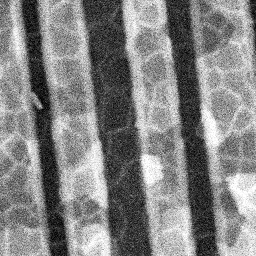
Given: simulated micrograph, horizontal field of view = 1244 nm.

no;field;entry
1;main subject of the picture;one or a few lines or trenches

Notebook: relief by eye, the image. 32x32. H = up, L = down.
HHLLLHHHHHLLLLLLHHHHLLLLHHHHHHLL
HHLLLLHHHHLLLLLLHHHHLLLLHHHHHHHL
HHLLLLHHHHLLLLLLHHHHLLLLHHHHHHHL
HHLLLLHHHHLLLLLLHHHHHLLLLHHHHHHL
HHHLLLHHHHLLLLLLHHHHHLLLLHHHHHHL
HHHLLLHHHHLLLLLLLHHHHLLLLHHHHHHL
HHHLLLHHHHHLLLLLLHHHHLLLLHHHHHHL
HHHLLLHHHHHLLLLLLHHHHLLLLHHHHHHL
HHHLLLHHHHHLLLLLLHHHHLLLLHHHHHHH
HHHLLLHHHHHLLLLLLHHHHLLLLHHHHHHH
HHHLLLHHHHHLLLLLLHHHHLLLLHHHHHHH
HHHHLLLHHHHLLLLLLHHHHLLLLHHHHHHH
HHHHHLLHHHHLLLLLLHHHHHLLLLHHHHHH
HHHHLLLHHHHLLLLLLHHHHHLLLLHHHHHH
HHHHLLLHHHHLLLLLLLHHHHLLLLHHHHHH
HHHHLLLHHHHLLLLLLLHHHHLLLLHHHHHH
HHHHLLLHHHHLLLLLLLHHHHLLLLHHHHHH
HHHHLLLHHHHHLLLLLLHHHHLLLLHHHHHH
HHHHLLLLHHHHLLLLLLHHHHLLLLHHHHHH
HHHHLLLLHHHHLLLLLLHHHHLLLLLHHHHH
HHHHLLLLHHHHLLLLLLHHHHHLLLLHHHHH
HHHHHLLLHHHHLLLLLLHHHHHLLLLHHHHH
HHHHHLLLHHHHLLLLLLLHHHHLLLLHHHHH
HHHHHLLLHHHHHLLLLLLHHHHLLLLHHHHH
HHHHHLLLHHHHHLLLLLLHHHHLLLLHHHHH
HHHHHLLLHHHHHLLLLLLHHHHLLLLHHHHH
HHHHHLLLHHHHHLLLLLLHHHHLLLLHHHHH
HHHHHLLLLHHHHLLLLLLHHHHHLLLHHHHH
HHHHHLLLLHHHHLLLLLLHHHHHLLLLHHHH
HHHHHHLLLHHHHLLLLLLHHHHHLLLLHHHH
HHHHHHLLLHHHHLLLLLLHHHHHLLLLHHHH
HHHHHHLLLHHHHLLLLLLLHHHHLLLLHHHH